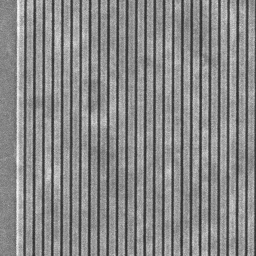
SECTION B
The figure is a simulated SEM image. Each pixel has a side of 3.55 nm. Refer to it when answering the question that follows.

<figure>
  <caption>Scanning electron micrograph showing parallel lines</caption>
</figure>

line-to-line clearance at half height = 9.8 nm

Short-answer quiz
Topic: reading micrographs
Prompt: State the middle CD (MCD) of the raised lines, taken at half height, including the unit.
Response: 22.2 nanometres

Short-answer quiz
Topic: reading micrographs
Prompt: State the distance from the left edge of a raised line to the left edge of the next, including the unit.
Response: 0.0327 um